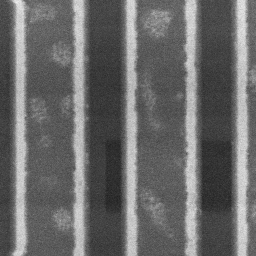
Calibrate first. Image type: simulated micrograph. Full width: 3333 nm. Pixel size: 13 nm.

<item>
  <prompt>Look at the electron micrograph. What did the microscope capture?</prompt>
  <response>one or a few lines or trenches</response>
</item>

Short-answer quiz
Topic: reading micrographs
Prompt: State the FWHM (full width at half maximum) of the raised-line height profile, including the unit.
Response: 59 px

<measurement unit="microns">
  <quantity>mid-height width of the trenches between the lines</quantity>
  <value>0.678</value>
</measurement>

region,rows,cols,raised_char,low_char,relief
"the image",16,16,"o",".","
.oooo...oooo...o
.oooo...oooo...o
.oooo...oooo...o
.oooo...oooo...o
.oooo...oooo...o
.oooo...oooo...o
.oooo...oooo...o
.oooo...oooo...o
.oooo...oooo...o
.oooo...oooo...o
.oooo...oooo...o
.oooo...oooo...o
.oooo...oooo...o
.oooo...oooo...o
.oooo...oooo...o
.oooo...oooo...o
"